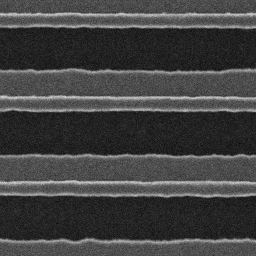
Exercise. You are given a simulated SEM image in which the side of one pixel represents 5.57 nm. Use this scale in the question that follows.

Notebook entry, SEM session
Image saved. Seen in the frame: lines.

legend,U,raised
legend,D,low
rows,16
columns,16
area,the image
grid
UUUUUUUUUUUUUUUU
UUUUUUUUUUUUUUUU
DDDDDDDDDDDDDDDD
DDDDDDDDDDDDDDDD
UUUUUUUUUUDUUUUU
UUUUUUUUUUUUUUUU
UUUUUUUUUUUUUUUU
DDDDDDDDDDDDDDDD
DDDDDDDDDDDDDDDD
DDDDDDDDDDDDDDDD
UUUUUUUUUUUUUUUU
UUUUUUUUUUUUUUUU
DDDDDDDDDDDDDDDD
DDDDDDDDDDDDDDDD
DDDDDDDDDDDDDDDD
UUUUUUUUUUUUUUUU